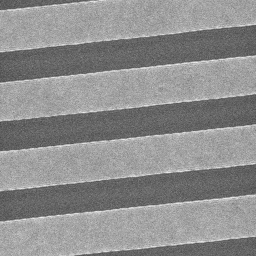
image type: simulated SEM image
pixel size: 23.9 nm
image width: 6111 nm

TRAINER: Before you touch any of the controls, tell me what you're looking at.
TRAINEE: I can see lines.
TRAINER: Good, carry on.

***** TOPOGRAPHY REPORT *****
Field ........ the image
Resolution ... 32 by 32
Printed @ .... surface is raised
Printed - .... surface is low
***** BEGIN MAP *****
---------@@@@@@@@@@@@@@@@@@@@@@@
@@@@@@@@@@@@@@@@@@@@@@@@@@@@@@@@
@@@@@@@@@@@@@@@@@@@@@@@@@@@@@@@@
@@@@@@@@@@@@@@@@@@@@@@@@@@@-----
@@@@@@@@@@@@@@@@@@@-------------
@@@@@@@@@@----------------------
--------------------------------
---------------------------@@@@@
-----------------@@@@@@@@@@@@@@@
--------@@@@@@@@@@@@@@@@@@@@@@@@
@@@@@@@@@@@@@@@@@@@@@@@@@@@@@@@@
@@@@@@@@@@@@@@@@@@@@@@@@@@@@@@@@
@@@@@@@@@@@@@@@@@@@@@@@@@-------
@@@@@@@@@@@@@@@@----------------
@@@@@@@-------------------------
--------------------------------
-----------------------@@@@@@@@@
---------------@@@@@@@@@@@@@@@@@
----@@@@@@@@@@@@@@@@@@@@@@@@@@@@
@@@@@@@@@@@@@@@@@@@@@@@@@@@@@@@@
@@@@@@@@@@@@@@@@@@@@@@@@@@@@@@@-
@@@@@@@@@@@@@@@@@@@@@@----------
@@@@@@@@@@@@@-------------------
@@@-----------------------------
-------------------------------@
----------------------@@@@@@@@@@
-----------@@@@@@@@@@@@@@@@@@@@@
--@@@@@@@@@@@@@@@@@@@@@@@@@@@@@@
@@@@@@@@@@@@@@@@@@@@@@@@@@@@@@@@
@@@@@@@@@@@@@@@@@@@@@@@@@@@@@@@@
@@@@@@@@@@@@@@@@@@@@@@----------
@@@@@@@@@@@@@-------------------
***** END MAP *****